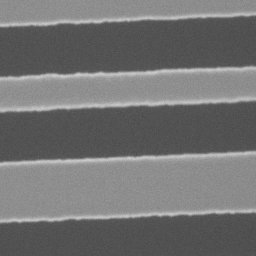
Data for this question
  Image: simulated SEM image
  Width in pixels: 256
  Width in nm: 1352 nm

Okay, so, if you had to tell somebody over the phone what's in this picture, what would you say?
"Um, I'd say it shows lines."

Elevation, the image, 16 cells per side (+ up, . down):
++++++++++++++++
++++............
................
................
.........+++++++
++++++++++++++++
++++++++++......
................
................
...............+
++++++++++++++++
++++++++++++++++
++++++++++++++++
+++++++++.......
................
................